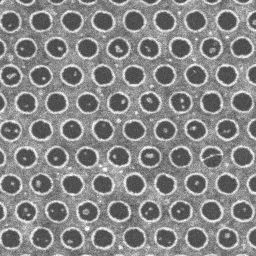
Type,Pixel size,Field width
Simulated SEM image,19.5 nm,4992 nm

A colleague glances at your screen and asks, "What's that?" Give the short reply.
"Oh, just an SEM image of a regular array of raised bodies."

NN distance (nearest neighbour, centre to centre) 598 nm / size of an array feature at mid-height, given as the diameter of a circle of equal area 423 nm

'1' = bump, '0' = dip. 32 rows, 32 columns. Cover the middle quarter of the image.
01100000011000000000000011000000
11110000111100011111000111100001
11111001111100011111000111110011
11111001111100011111000111110011
11110000111100001110000111100001
00000000000000000000000000000000
00000000000000000000000000000000
00000110000011100000111000011110
00001111000111110001111100011111
10011111100111110001111100011111
10011111100111110001111100011111
00001111000111110000111000011110
00000000000000000000000000000000
00000000000000000000000000000000
11110000111000001110000011100001
11110001111100011111000111110011
11111001111100011111000111110011
11111000111100011111000111110001
11110000111100001110000111100000
00000000000000000000000000000000
00000000000000000000000000000000
00001110000011110001111100011110
10011111000111110001111100011111
10011111100111111001111100011111
10001111000111110001111100011111
00000110000001100000111000001110
00000000000000000000000000000000
00000000000000000110000000000000
11110000111000001111000111100001
11111001111100011111000111110011
11111001111100011111000111110011
11111000111100001111000111110001